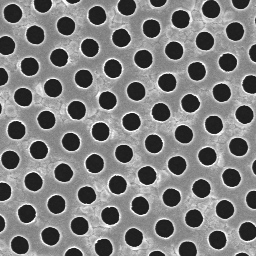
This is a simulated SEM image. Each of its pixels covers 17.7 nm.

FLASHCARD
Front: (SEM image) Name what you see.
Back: a regular array of holes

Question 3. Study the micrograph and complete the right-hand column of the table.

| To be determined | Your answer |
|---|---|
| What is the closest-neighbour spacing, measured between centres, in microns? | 0.549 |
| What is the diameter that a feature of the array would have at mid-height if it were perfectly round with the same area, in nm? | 325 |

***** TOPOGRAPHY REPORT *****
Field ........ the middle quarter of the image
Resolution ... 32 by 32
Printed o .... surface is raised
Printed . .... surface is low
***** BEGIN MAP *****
oooooooooo....ooooo..oooooooooo.
oooo.ooooo....ooooooooooooooooo.
ooo....ooo....ooooooooooo..oooo.
ooo....ooooo.ooooooooooo....oooo
ooo....oooooooooooooooo.....oooo
oooo..oooooooooo....oooo....oooo
oooooooooooooooo....ooooo..ooooo
ooooooooo...oooo....oooooooooooo
ooooooooo....oooo...oooooooooo..
oo..ooooo....oooooooooooooooo...
o....oooo....oooooooooo...oooo..
o....ooooooooooooooooo....oooo..
o....ooooooooooo..oooo.....ooooo
oo...oooooooooo....ooo....oooooo
ooooooooooooooo....ooooooooooooo
ooooooo....oooo....oooooooooo..o
ooooooo....ooooo..oooooooooo....
...oooo....ooooooooooooooooo....
....ooo....oooooooooo...oooo....
....oooooooooooooooo.....oooo..o
....oooooooooo..oooo.....ooooooo
o..oooooooooo....oooo...oooooooo
ooooooo.ooooo....ooooooooooooooo
oooooo...oooo....oooooooooo...oo
ooooo.....oooo..oooooooooo....oo
.oooo.....oooooooooooooooo.....o
..oooo...oooooooooo....ooo....oo
..oooooooooooooooo.....ooooo.ooo
..oooooooooo...oooo....ooooooooo
ooooooooooo.....ooo...oooooooooo
ooooooooooo.....oooooooooooooooo
oooo....oooo...oooooooooo...oooo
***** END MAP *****